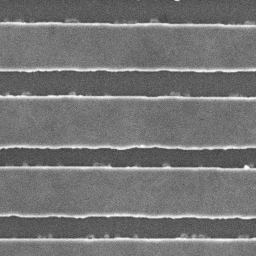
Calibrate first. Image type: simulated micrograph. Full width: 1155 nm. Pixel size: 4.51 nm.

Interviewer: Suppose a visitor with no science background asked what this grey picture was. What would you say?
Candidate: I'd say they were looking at lines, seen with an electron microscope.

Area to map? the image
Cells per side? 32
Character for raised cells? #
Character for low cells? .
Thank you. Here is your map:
................................
................................
................................
################################
################################
################################
################################
################################
################################
................................
................................
................................
################################
################################
################################
################################
################################
################################
#....###.#.######...###########.
................................
................................
################################
################################
################################
################################
################################
################################
................................
................................
................................
################################
################################